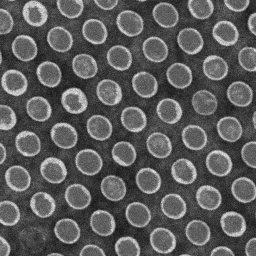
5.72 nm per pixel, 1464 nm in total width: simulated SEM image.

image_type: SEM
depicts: a regular array of raised bodies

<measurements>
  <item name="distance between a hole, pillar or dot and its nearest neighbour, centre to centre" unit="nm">205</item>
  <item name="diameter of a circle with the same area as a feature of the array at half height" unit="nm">138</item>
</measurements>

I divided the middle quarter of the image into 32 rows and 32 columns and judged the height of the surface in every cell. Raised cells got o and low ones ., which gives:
..oooooo....oooo...........ooo..
...ooooo..................ooooo.
...ooooo..........oooo....oooooo
.................oooooo...oooooo
.........ooo.....oooooo....oooo.
.........oooo....oooooo.....ooo.
.ooo....oooooo....ooooo.........
ooooo....ooooo.....ooo..........
ooooo....ooooo..................
oooooo....ooo...........oooo....
oooooo..................ooooo...
.oooo..........oooo....oooooo...
...............ooooo....ooooo...
.......ooo.....ooooo....ooooo...
......ooooo....ooooo.....ooo....
oo....oooooo...ooooo...........o
ooo...oooooo....ooo...........oo
ooo....ooooo...........o......oo
ooo.....ooo..........ooooo....oo
ooo...........o......ooooo....oo
oo...........oooo....oooooo....o
............ooooo....oooooo.....
....oooo....oooooo....oooo......
...oooooo....ooooo..............
...oooooo....oooo...........ooo.
...oooooo..................ooooo
....ooooo...........oo.....ooooo
......o............oooo....ooooo
..........oooo....oooooo....oooo
..........ooooo...oooooo.....ooo
..oo.....oooooo....ooooo........
.ooooo...oooooo....oooo.........